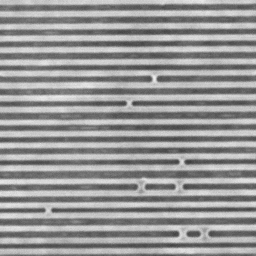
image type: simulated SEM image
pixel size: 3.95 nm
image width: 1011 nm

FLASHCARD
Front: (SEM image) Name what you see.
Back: parallel lines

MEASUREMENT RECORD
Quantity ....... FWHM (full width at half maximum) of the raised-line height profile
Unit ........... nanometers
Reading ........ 18.2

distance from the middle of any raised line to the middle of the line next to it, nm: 46.8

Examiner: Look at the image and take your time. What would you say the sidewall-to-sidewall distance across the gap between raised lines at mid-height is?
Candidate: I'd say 29.6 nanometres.